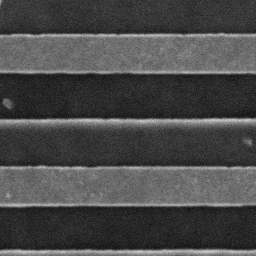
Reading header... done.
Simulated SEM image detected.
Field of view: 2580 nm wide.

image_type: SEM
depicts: lines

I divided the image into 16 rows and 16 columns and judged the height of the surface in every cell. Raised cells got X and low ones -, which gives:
XXXXXXXXXXXXXXXX
XXXXXXXXXXXXXXXX
XXXXXXXXXXXXXXXX
XXXXXXXXXXXXXXXX
XXXXXXXXXXXXXXXX
----------------
----------------
-----X------XXXX
XXXXXXXXXXXXXXXX
XXXXXXXXXXXXXXXX
XXXXXXXXXXXXXXXX
XXXXXXXXXXXXXXXX
XXXXXXXXXXXXXXXX
----------------
----------------
----------------